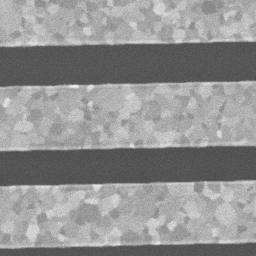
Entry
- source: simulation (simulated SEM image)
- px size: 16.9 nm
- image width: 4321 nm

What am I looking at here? lines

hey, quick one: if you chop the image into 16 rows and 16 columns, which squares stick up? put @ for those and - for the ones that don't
@@@@@@@@@@@@@@@@
@@@@@@@@@@@@@@@@
@@@@@@@@@@@@@@@@
----------------
----------------
@@@@@@@@@@@@@@@@
@@@@@@@@@@@@@@@@
@@@@@@@@@@@@@@@@
@@@@@@@@@@@@@@@@
----------------
----------------
------@@@@@@@@@@
@@@@@@@@@@@@@@@@
@@@@@@@@@@@@@@@@
@@@@@@@@@@@@@@@@
----------------